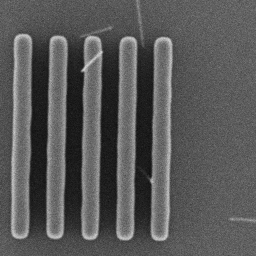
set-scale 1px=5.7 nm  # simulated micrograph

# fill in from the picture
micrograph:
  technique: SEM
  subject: groups of lines, slits or small figures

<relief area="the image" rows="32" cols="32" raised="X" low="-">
--------------------------------
--------------------------------
--------------------------------
--------------------------------
--XX----------------------------
--XX--XX---XX--XX--XX-----------
--XX--XX---XX--XX--XX-----------
--XX--XX---XX--XX--XX-----------
--XX--XX--XXX--XX--XX-----------
--XX--XX---XX--XX--XX-----------
--XX--XX--XXX--XX--XX-----------
--XX--XX--XXX--XX--XX-----------
--XX--XX--XXX--XX--XX-----------
--XX--XX--XXX--XX--XX-----------
--XX--XX--XXX--XX--XX-----------
--XX--XX--XXX--XX--XX-----------
--XX--XX--XXX--XX--XX-----------
--XX--XX--XXX--XX--XX-----------
--XX--XX--XXX--XX--XX-----------
--XX--XX--XX---XX--XX-----------
--XX--XX--XX---XX--XX-----------
--XX--XX--XX---XX--XX-----------
--XX--XX--XX---XX--XX-----------
--XX--XX--XX---XX--XX-----------
--XX--XX--XX---XX--XX-----------
--XX--XX--XX---XX--XX-----------
--XX--XX--XX---XX--XX-----------
--XX--XX--XX---XX--XX-----------
--XX--XX--XX---XX--XX-----------
--X---XX--XX---X---XX-----------
--------------------------------
--------------------------------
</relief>